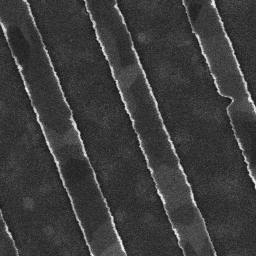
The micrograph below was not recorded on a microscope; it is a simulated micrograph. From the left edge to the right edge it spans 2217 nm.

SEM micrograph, one or a few lines or trenches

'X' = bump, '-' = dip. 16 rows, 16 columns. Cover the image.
XX---XX-----XX--
XX----XX----XX--
XXX---XX----XX--
-XX----XX----XX-
-XX----XX----XX-
--XX---XX-----X-
--XX----XX----XX
--XXX---XX----XX
---XX----XX----X
---XX----XX----X
----XX---XX----X
----XX----XX----
----XXX---XX----
-----XX---XXX---
X----XX----XX---
X-----XX---XX---